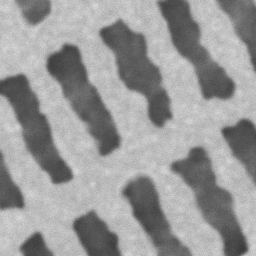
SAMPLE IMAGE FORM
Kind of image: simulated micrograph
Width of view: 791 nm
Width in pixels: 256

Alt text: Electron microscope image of holes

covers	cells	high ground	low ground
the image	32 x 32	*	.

**....**************....***.....
***...**************....****....
***..****************...*****...
*************...*****....****...
*************.....***....*****..
********.****.....****...******.
******....****....****....*****.
******....****.....****....****.
******.....****.....****....****
*..***.....****.....*****....***
....***.....***......****....***
....****....*****....****....***
*....***.....*****...*******.***
**...****....*****...***********
**....****....****....**********
**....****....*****..********...
***...*****....*************....
***....*****...*************....
***....*****...*********..***...
****....***************...***...
.****...*************......***..
.*****...************......****.
..****...*******...****....****.
..*************.....****....****
...************.....****.....***
...*************....****.....***
***********.****....*****....***
*********....****....*****....**
*********.....****...******...**
****.*****.....***....*****....*
***...****.....****....*****...*
***....****....****.....****...*